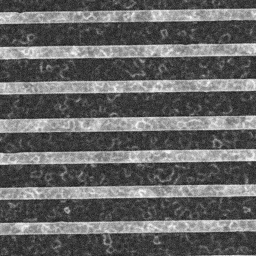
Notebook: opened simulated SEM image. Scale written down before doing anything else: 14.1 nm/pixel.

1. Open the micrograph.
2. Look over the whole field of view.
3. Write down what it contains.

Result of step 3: parallel lines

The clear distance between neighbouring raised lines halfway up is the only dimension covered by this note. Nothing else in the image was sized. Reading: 24.3 pixels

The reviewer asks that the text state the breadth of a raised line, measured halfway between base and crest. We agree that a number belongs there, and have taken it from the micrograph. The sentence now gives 11.3 pixels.